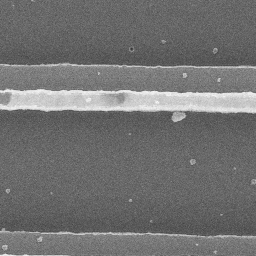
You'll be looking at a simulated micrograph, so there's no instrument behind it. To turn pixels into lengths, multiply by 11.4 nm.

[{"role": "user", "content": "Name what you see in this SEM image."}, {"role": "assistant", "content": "lines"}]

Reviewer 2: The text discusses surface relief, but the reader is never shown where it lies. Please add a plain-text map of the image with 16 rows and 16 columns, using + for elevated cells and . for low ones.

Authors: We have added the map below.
................
................
................
................
++++++++++++++++
++++++++++++++++
++++++++++++++++
................
................
................
................
................
................
................
................
++++++++++++++++